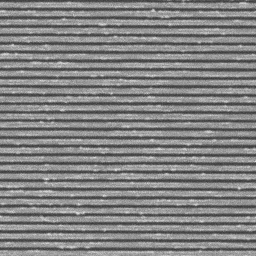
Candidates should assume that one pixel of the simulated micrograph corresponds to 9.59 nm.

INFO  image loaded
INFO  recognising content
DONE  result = parallel lines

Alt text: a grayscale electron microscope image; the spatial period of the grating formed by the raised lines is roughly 82.1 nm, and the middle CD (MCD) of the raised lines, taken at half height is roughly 0.0503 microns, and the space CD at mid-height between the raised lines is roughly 0.0336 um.